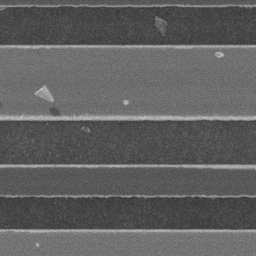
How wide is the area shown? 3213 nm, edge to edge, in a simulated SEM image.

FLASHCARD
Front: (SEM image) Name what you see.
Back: lines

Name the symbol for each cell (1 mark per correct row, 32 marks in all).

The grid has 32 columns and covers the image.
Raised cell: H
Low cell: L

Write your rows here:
HHHHHHHHHHHHHHHHHHHHHHHHHHHHHHHH
LLLLLLLLLLLLLLLLLLLLLLLLLLLLLLLL
LLLLLLLLLLLLLLLLLLLLLLLLLLLLLLLL
LLLLLLLLLLLLLLLLLLLLLLLLLLLLLLLL
LLLLLLLLLLLLLLLLLLLLLLLLLLLLLLLL
LLLLLLLLLLLLLLLLLLLLLLLLLLLLLLLL
HHHHHHHHHHHHHHHHHHHHHHHHHHHHHHHH
HHHHHHHHHHHHHHHHHHHHHHHHHHHHHHHH
HHHHHHHHHHHHHHHHHHHHHHHHHHHHHHHH
HHHHHHHHHHHHHHHHHHHHHHHHHHHHHHHH
HHHHHHHHHHHHHHHHHHHHHHHHHHHHHHHH
HHHHHHHHHHHHHHHHHHHHHHHHHHHHHHHH
HHHHHHHHHHHHHHHHHHHHHHHHHHHHHHHH
HHHHHHHHHHHHHHHHHHHHHHHHHHHHHHHH
HHHHHHHHHHHHHHHHHHHHHHHHHHHHHHHH
LLLLLLLLLLLLLLLLLLLLLLLLLLLLLLLL
LLLLLLLLLLLLLLLLLLLLLLLLLLLLLLLL
LLLLLLLLLLLLLLLLLLLLLLLLLLLLLLLL
LLLLLLLLLLLLLLLLLLLLLLLLLLLLLLLL
LLLLLLLLLLLLLLLLLLLLLLLLLLLLLLLL
LLLLLLLLLLLLLLLLLLLLLLLLLLLLLLLL
HHHHHHHHHHHHHHHHHHHHHHHHHHHHHHHH
HHHHHHHHHHHHHHHHHHHHHHHHHHHHHHHH
HHHHHHHHHHHHHHHHHHHHHHHHHHHHHHHH
HHHHHHHHHHHHHHHHHHHHHHHHHHHHHHHH
LLLLLLLLLLLLLLLLLLLLLLLLLLLLLLLL
LLLLLLLLLLLLLLLLLLLLLLLLLLLLLLLL
LLLLLLLLLLLLLLLLLLLLLLLLLLLLLLLL
LLLLLLLLLLLLLLLLLLLLLLLLLLLLLLLL
HHHHHHHHHHHHHHHHHHHHHHHHHHHHHHHH
HHHHHHHHHHHHHHHHHHHHHHHHHHHHHHHH
HHHHHHHHHHHHHHHHHHHHHHHHHHHHHHHH